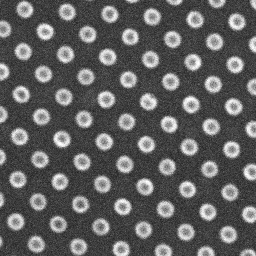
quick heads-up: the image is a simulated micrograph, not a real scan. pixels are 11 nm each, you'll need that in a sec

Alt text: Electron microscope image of a regular array of raised bodies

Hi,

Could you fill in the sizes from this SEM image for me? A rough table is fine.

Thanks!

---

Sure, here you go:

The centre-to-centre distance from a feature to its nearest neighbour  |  326 nanometers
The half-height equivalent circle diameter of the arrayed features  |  166 nm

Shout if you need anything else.